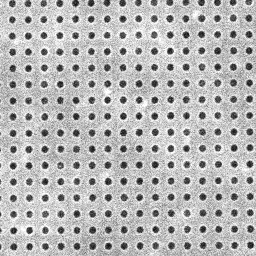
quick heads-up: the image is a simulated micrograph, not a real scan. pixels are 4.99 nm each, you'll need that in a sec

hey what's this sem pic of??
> a regular array of holes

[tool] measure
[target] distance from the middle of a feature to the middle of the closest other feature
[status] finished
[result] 77.2 nm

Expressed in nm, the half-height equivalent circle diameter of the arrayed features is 38.6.